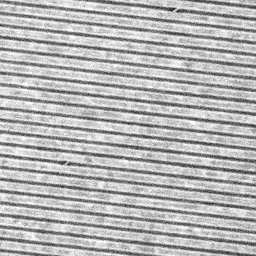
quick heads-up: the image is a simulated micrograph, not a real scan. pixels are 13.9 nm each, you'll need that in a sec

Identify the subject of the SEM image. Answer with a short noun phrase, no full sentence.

parallel lines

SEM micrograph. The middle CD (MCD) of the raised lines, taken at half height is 88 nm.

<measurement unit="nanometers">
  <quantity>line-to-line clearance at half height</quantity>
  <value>76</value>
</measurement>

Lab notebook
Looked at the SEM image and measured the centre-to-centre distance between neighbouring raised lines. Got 164 nanometres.